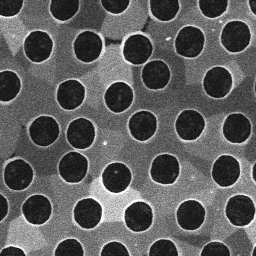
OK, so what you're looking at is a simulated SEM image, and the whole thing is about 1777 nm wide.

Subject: a regular array of holes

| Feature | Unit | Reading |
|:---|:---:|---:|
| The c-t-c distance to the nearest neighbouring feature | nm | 304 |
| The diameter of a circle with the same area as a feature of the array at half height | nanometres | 209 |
